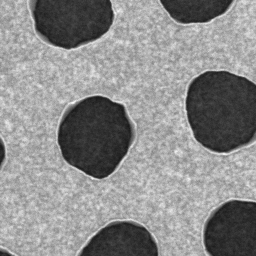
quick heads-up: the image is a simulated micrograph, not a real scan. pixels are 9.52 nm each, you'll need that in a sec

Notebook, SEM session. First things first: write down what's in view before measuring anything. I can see holes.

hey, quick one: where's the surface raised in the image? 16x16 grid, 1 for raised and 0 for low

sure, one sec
1100000111000011
1100000111111111
1110001111111111
1111111111111111
1111111111111011
1111111111110000
1111100111110000
1111000011110000
1111000011110000
1111000011111111
1111100111111111
1111111111111111
1111111111111111
1111111111111000
1111110001111000
1111100000111000